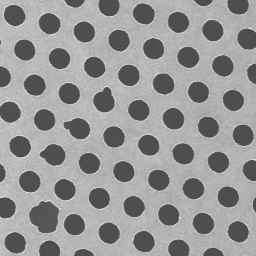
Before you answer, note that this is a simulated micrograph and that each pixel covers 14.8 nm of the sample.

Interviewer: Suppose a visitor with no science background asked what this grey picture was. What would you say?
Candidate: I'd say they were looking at a regular array of holes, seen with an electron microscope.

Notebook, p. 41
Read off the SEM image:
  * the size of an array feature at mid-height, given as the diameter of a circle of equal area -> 21.4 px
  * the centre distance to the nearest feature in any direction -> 526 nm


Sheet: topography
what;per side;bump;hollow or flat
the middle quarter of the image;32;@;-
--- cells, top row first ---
-@@@@-----@@@@@--@@@@@@@@@@@@@--
@@@@@-----@@@@----@@@@@@@@@@@@@@
@@@@@@----@@@------@@@@@--@@@@@@
@@@@@@@@@@@@@@-----@@@@----@@@@@
@@@@@@@@@@@@@@----@@@@------@@@@
---@@@@@@@@@@@@@-@@@@@------@@@-
----@@@@@@--@@@@@@@@@@@----@@@@-
----@@@@----@@@@@@@@@@@@--@@@@@-
----@@@-----@@@@@@@@@@@@@@@@@@@-
---@@@@------@@@@---@@@@@@@@@@@@
@@@@@@@@-----@@@-----@@@@@@@@@@@
@@@@@@@@----@@@@-----@@@@@---@@@
@@@@@@@@@@@@@@@@-----@@@@-----@@
@@@@@@@@@@@@@@@@@----@@@@-----@@
------@@@@@@@@@@@@@@@@@@@-----@@
------@@@@@@@@@@@@@@@@@@@@----@@
@------@@@----@@@@@@@@@@@@@@@@@@
@@----@@@@-----@@@@@@@@@@@@@@@@@
@@@--@@@@@-----@@@@----@@@@@@@@@
@@@@@@@@@@-----@@@@-----@@@@@@@@
@@@@@@@@@@@---@@@@------@@@@----
@@@@@@@@@@@@@@@@@@@-----@@@-----
@@@@@--@@@@@@@@@@@@@---@@@@-----
@@@@----@@@@@@@@@@@@@@@@@@@-----
@@@@-----@@@@@--@@@@@@@@@@@@----
@@@@-----@@@@----@@@@@@@@@@@@@@@
@@@@----@@@@------@@@@@-@@@@@@@@
@@@@@@@@@@@@------@@@-----@@@@@@
@@@@@@@@@@@@@----@@@@-----@@@@@@
--@@@@@@@@@@@@--@@@@@-----@@@@--
---@@@@@@@@@@@@@@@@@@@----@@@@--
---@@@@---@@@@@@@@@@@@@--@@@@@--